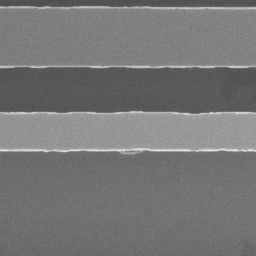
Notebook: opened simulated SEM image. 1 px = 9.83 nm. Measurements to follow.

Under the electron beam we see lines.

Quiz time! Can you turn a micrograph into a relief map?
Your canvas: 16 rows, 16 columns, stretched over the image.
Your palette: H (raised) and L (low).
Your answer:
HHHHHHHHHHHHHHHH
HHHHHHHHHHHHHHHH
HHHHHHHHHHHHHHHH
HHHHHHHHHHHHHHHH
LLLLLLLLLLLLLLLL
LLLLLLLLLLLLLLLL
LLLLLLLLLLLLLLLL
HHHHHHHHHHHHHHHH
HHHHHHHHHHHHHHHH
LLLLLLLLLLLLLLLL
LLLLLLLLLLLLLLLL
LLLLLLLLLLLLLLLL
LLLLLLLLLLLLLLLL
LLLLLLLLLLLLLLLL
LLLLLLLLLLLLLLLL
LLLLLLLLLLLLLLLL